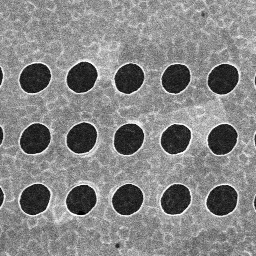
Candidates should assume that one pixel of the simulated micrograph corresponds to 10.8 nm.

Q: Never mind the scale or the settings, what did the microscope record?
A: a regular array of holes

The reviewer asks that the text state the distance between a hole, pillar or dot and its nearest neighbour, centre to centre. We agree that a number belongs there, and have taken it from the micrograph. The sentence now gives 46.7 px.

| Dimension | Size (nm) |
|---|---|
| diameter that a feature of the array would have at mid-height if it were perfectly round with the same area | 334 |